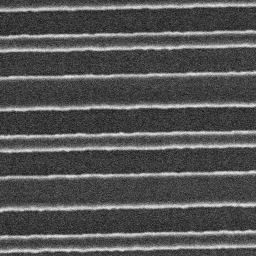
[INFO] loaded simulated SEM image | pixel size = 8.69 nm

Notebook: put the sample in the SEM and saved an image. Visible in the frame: lines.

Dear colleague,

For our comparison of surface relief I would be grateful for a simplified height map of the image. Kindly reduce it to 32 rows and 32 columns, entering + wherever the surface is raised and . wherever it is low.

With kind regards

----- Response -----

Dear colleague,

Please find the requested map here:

++++++++++++++++++++++++++++++++
................................
................................
................................
..++.+++++++++++++++++++++++++++
++++++++++++++++++++++++++++++++
................................
................................
................................
..............++++++++++++++++++
++++++++++++++++++++++++++++++++
++++++++++++++++++++++++++++++++
++++++++++++++++++++++++++++++++
+++++++++++++++++...............
................................
................................
............................++++
++++++++++++++++++++++++++++++++
++++++++++++++++++++............
................................
................................
...............................+
++++++++++++++++++++++++++++++++
++++++++++++++++++++++++++++++++
++++++++++++++++++++++++++++++++
++++++++++++++++++++++++++++++++
................................
................................
................................
....++++++++++++++++++++++++++++
++++++++++++++++++++++++++++++++
++..+...........................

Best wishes